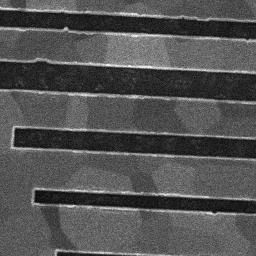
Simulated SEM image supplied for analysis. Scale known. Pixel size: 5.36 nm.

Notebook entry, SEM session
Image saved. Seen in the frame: one or a few lines or trenches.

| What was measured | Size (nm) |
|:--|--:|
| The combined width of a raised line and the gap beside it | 329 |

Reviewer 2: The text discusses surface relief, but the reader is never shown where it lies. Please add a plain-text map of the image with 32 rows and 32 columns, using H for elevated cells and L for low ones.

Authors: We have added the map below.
HHHHHHHHHHHHHHHHHHHHHHHHHHHHHHHH
LLLLLLLLHHHHHHHHHHHHHHHHHHHHHHHH
LLLLLLLLLLLLLLLLLLLLLLLLLHLLHHHH
HLLLLLLLLLLLLLLLLLLLLLLLLLLLLLLL
HHHHHHHHHHHHHHHHHHHHHHHLLLLLLLLL
HHHHHHHHHHHHHHHHHHHHHHHHHHHHHHHH
HHHHHHHHHHHHHHHHHHHHHHHHHHHHHHHH
HHHHHHHHHHHHHHHHHHHHHHHHHHHHHHHH
LLLLLLLLLLLLLLLLLLLLHHHHHHHHHHHH
LLLLLLLLLLLLLLLLLLLLLLLLLLLLLLLL
LLLLLLLLLLLLLLLLLLLLLLLLLLLLLLLL
HHHHHHHLLLLLLLLLLLLLLLLLLLLLLLLL
HHHHHHHHHHHHHHHHHHHHHHHHHHLLLLLL
HHHHHHHHHHHHHHHHHHHHHHHHHHHHHHHH
HHHHHHHHHHHHHHHHHHHHHHHHHHHHHHHH
HHHHHHHHHHHHHHHHHHHHHHHHHHHHHHHH
HHLLLLLLLLLLLHHLHHHHHHHHHHHHHHHH
HHLLLLLLLLLLLLLLLLLLLLLLLLLLLLLL
HHHHLLLLLLLLLLLLLLLLLLLLLLLLLLLL
HHHHHHHHHHHHHHHHHHHHHHLLLLLLLLLL
HHHHHHHHHHHHHHHHHHHHHHHHHHHHHHHH
HHHHHHHHHHHHHHHHHHHHHHHHHHHHHHHH
HHHHHHHHHHHHHHHHHHHHHHHHHHHHHHHH
HHHHHHHHHHHHHHHHHHHHHHHHHHHHHHHH
HHHHLLLLLLLLLLLLLLLLLLHHHHHHHHHH
HHHHHHLLLLLLLLLLLLLLLLLLLLLLLLLL
HHHHHHHHHHHHHHHHHHHHHHHHHHLLLLLL
HHHHHHHHHHHHHHHHHHHHHHHHHHHHHHHH
HHHHHHHHHHHHHHHHHHHHHHHHHHHHHHHH
HHHHHHHHHHHHHHHHHHHHHHHHHHHHHHHH
HHHHHHHHHHHHHHHHHHHHHHHHHHHHHHHH
HHHHHHHLLLHHHHHHHHHHHHHHHHHHHHHH